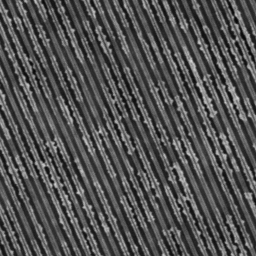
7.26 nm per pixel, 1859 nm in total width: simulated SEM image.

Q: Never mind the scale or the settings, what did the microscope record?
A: parallel lines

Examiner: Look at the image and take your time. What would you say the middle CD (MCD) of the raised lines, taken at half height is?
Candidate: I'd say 0.0308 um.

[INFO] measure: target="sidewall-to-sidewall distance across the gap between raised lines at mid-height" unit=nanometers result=30.8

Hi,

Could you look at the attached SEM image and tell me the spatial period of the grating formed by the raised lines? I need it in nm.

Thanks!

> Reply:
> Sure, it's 65.1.